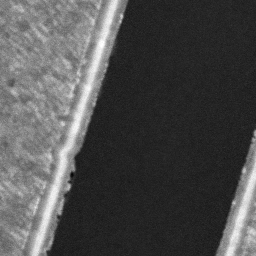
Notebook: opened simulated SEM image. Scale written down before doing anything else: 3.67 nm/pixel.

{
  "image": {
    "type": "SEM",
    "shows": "one or a few lines or trenches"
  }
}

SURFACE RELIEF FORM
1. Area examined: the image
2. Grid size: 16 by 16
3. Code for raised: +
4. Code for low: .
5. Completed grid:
+++++++.........
+++++++.........
++++++..........
++++++..........
++++++..........
+++++...........
+++++...........
+++++...........
+++++...........
++++............
++++............
++++............
+++............+
+++............+
+++............+
++............++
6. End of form